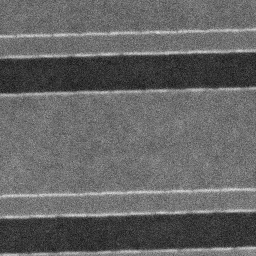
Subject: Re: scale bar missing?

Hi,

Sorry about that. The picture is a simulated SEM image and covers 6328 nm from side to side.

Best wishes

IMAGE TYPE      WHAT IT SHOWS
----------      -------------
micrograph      lines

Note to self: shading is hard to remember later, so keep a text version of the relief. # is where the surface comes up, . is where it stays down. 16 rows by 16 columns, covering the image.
################
################
################
####............
................
................
################
################
################
################
################
################
################
###.............
................
................